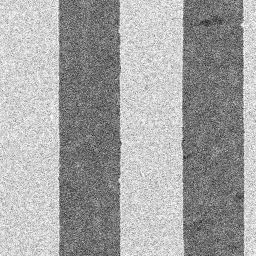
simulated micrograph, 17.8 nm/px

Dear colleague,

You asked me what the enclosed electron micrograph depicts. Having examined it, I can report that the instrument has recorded one or a few lines or trenches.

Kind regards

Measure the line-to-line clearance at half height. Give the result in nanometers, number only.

1110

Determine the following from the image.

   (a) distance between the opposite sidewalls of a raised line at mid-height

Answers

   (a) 1090 nm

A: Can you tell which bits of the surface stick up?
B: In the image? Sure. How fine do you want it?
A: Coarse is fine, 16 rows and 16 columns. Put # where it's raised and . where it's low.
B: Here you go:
####....###....#
####....###....#
####....###....#
####....###....#
####....###....#
####....###....#
####....###....#
####....###....#
####....###....#
####....###....#
####....###....#
####....###....#
####....###....#
####....###....#
####....###....#
####....###....#